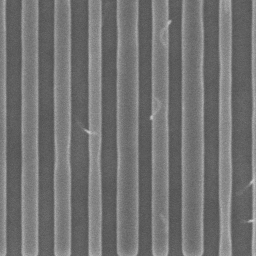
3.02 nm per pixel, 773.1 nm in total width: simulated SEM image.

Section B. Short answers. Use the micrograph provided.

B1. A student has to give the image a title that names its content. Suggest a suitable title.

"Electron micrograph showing groups of lines, slits or small figures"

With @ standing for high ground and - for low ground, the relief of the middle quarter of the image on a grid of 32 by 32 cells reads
@-----@@@----@@@@@----@@@@----@@
@-----@@@----@@@@@----@@@@----@@
@-----@@@----@@@@@----@@@@----@@
@-----@@@----@@@@@----@@@@----@@
@-----@@@----@@@@@----@@@@----@@
@-----@@@----@@@@@----@@@@----@@
@-----@@@----@@@@@----@@@@----@@
@-----@@@----@@@@@----@@@@----@@
@-----@@@----@@@@@@---@@@@----@@
@-----@@@----@@@@@----@@@@----@@
@-----@@@----@@@@@----@@@@----@@
@-----@@@----@@@@@----@@@@----@@
@-----@@@----@@@@@----@@@@----@@
@-----@@@----@@@@@----@@@@----@@
@-----@@@----@@@@@----@@@@----@@
@-----@@@----@@@@@----@@@@----@@
@-----@@@----@@@@@----@@@@----@@
@-----@@@----@@@@@----@@@@----@@
@-----@@@----@@@@@----@@@@----@@
@-----@@@----@@@@@----@@@@----@@
@-----@@@----@@@@@----@@@@----@@
@-----@@@-----@@@@----@@@@----@@
@-----@@@-----@@@@----@@@@----@@
@-----@@@-----@@@@----@@@@----@@
@-----@@@-----@@@@----@@@@----@@
@-----@@@-----@@@@----@@@@----@@
@-----@@@-----@@@@----@@@@----@@
@-----@@@----@@@@@----@@@@----@@
@-----@@@----@@@@@----@@@@----@@
@-----@@@----@@@@@----@@@@----@@
@-----@@@----@@@@@----@@@@----@@
@-----@@@----@@@@@----@@@@----@@